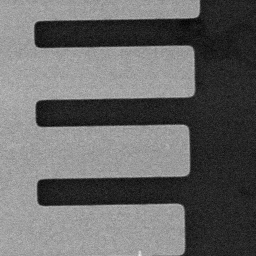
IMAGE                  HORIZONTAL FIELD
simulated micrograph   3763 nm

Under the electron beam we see groups of lines, slits or small figures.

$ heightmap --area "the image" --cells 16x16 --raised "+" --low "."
++++++++++++....
++..............
++..............
++++++++++++....
++++++++++++....
++++++++++++....
++..............
++..............
++++++++++++....
++++++++++++....
++++++++++++....
++..............
++..............
++++++++++++....
++++++++++++....
++++++++++++....